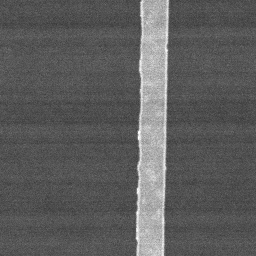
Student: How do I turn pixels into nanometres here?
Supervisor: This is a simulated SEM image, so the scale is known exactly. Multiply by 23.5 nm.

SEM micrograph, one or a few lines or trenches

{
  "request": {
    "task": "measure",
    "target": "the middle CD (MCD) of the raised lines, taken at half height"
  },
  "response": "589 nanometres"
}